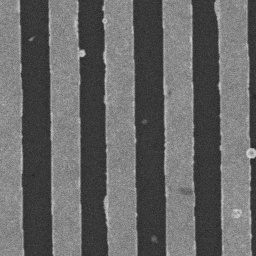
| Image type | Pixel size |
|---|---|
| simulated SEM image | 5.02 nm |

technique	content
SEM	lines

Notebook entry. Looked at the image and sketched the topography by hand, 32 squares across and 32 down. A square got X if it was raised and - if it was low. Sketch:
XX----XXXX---XXXX---XXXX---XXXX-
XX----XXXX---XXXX---XXXX---XXXX-
XX----XXXX---XXXX---XXXX---XXXX-
XXX---XXXX---XXXX---XXXX---XXXX-
XXX---XXXX---XXXX----XXX---XXXX-
XXX---XXXX---XXXX----XXX---XXXX-
XXX---XXXX---XXXX----XXX---XXXX-
XXX---XXXX---XXXX----XXX----XXX-
XXX---XXXX---XXXX----XXX----XXX-
XXX---XXXX---XXXX----XXX----XXX-
XXX---XXXX---XXXX----XXX----XXX-
XXX---XXXX---XXXX----XXX----XXX-
XXX---XXXX---XXXX----XXX----XXX-
XXX---XXXX---XXXX----XXX----XXX-
XXX---XXXX---XXXX----XXX----XXX-
XXX----XXX---XXXX----XXX----XXX-
XXX---XXXX---XXXX----XXX----XXX-
XXX----XXX---XXXX----XXX----XXX-
XXX----XXX---XXXX----XXX----XXXX
XXX----XXX---XXXX----XXX----XXXX
XXX----XXX---XXXX----XXX----XXX-
XXX----XXX---XXXX----XXX----XXX-
XXX----XXX---XXXX----XXX----XXX-
XXX----XXX---XXXX----XXX----XXX-
XXX----XXX---XXXX----XXX----XXX-
XXX----XXX---XXXX----XXX----XXX-
XXX----XXX---XXXX----XXX----XXX-
XXX----XXX---XXXX----XXX----XXX-
XXX----XXX----XXX----XXX----XXX-
XXX----XXX----XXX----XXX----XXX-
XXX----XXX----XXX----XXX----XXX-
XXX----XXX----XXX----XXX----XXX-